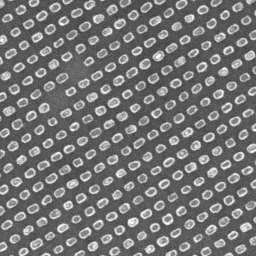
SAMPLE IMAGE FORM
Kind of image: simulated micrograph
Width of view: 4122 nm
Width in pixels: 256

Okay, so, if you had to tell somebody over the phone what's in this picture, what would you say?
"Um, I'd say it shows a regular array of raised bodies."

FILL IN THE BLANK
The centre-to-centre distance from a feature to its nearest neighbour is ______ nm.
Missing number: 247